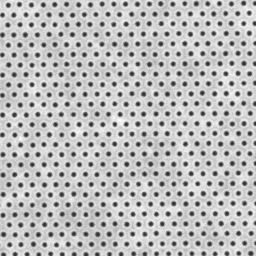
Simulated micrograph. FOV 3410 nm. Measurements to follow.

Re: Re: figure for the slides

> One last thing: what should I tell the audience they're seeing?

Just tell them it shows a regular array of holes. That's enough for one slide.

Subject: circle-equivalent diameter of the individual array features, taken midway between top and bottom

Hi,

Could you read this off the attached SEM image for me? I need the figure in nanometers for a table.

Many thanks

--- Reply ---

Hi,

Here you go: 70.5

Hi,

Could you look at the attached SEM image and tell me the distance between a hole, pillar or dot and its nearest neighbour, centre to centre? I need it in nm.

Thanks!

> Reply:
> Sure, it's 148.